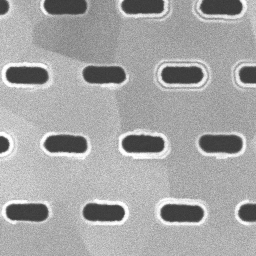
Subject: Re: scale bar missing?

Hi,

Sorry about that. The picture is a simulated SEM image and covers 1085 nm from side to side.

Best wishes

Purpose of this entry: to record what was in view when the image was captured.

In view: a regular array of holes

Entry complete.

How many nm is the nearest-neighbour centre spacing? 330